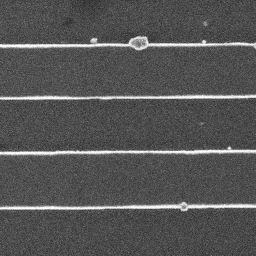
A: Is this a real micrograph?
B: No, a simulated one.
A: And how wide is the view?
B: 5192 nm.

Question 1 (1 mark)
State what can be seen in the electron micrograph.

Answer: lines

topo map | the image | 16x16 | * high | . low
................
................
........*.......
****************
****************
****************
................
................
................
.........*******
****************
****************
****************
................
................
................